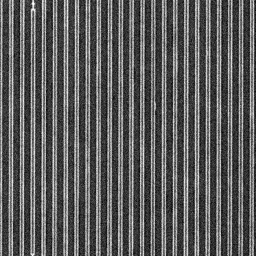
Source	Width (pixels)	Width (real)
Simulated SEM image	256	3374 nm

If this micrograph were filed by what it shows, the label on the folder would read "parallel lines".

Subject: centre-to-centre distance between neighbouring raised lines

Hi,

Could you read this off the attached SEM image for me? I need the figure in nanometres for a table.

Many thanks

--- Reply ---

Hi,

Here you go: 144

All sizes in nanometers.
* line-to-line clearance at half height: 102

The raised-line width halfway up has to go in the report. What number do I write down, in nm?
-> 37.9